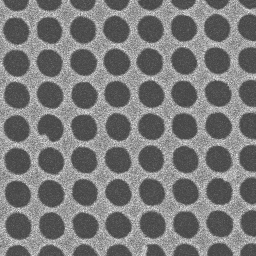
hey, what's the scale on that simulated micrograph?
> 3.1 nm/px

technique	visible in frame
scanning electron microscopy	a regular array of holes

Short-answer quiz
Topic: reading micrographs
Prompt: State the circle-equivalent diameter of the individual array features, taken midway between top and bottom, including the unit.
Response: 81.8 nanometers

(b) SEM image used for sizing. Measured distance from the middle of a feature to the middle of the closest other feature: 0.101 um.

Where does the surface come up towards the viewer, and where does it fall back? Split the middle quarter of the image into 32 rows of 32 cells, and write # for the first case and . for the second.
##......##......##.......##.....
##......###.....###.....####....
###....#####...#####...######...
################################
####.#######..######...#####...#
###....####.....###.....###.....
##......##......###......##.....
##......##.......##......##.....
##......##......###......##.....
###.....###.....###......###....
###....#####...#####....#####...
################################
############..#######.#######..#
###....####.....###.....###.....
##......###.....###......##.....
##......##.......#.......##.....
##......###......##......##.....
##......###.....###......###....
###....#####....####....#####...
################################
#####################..#########
###....####....####.....####....
##......##......###......##.....
##......##......###......##.....
##......##.......##......##.....
##......###......##......###....
###.....####....####....####....
################################
################################
###....####.....###.....####....
##......###.....###......##.....
##......##......###......##.....